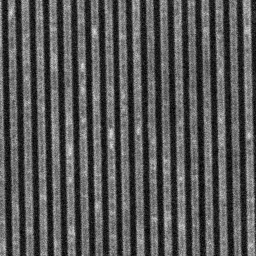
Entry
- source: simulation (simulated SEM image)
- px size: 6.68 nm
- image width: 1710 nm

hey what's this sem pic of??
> parallel lines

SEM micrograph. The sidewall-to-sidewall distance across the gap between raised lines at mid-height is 47.6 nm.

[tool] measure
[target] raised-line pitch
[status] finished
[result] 92.5 nanometers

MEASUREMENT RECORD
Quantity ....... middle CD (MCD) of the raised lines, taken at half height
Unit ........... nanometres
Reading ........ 41.8